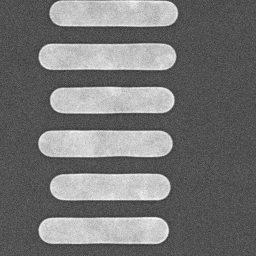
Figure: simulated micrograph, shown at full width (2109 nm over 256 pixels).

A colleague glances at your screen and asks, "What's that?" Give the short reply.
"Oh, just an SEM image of groups of lines, slits or small figures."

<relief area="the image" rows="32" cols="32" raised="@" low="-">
-------@@@@@@@@@@@@@@@----------
------@@@@@@@@@@@@@@@@----------
-------@@@@@@@@@@@@@@@----------
--------------------------------
--------------------------------
-----------------@@@------------
-----@@@@@@@@@@@@@@@@@----------
-----@@@@@@@@@@@@@@@@@----------
------@@@@@@@@@@@@@@@-----------
--------------------------------
--------------------------------
-------@@@@@@@@@@@@@@-----------
------@@@@@@@@@@@@@@@@----------
-------@@@@@@@@@@@@@@-----------
--------------------------------
--------------------------------
------@@@@@@@@@@@@@@------------
-----@@@@@@@@@@@@@@@@-----------
-----@@@@@@@@@@@@@@@@-----------
------@@@@@@@@--@@@@------------
--------------------------------
--------------------------------
-------@@@@@@@@@@@@@@-----------
------@@@@@@@@@@@@@@@-----------
-------@@@@@@@@@@@@@@-----------
--------------------------------
--------------------------------
------@@@@@@@@@@@@@@------------
-----@@@@@@@@@@@@@@@@-----------
-----@@@@@@@@@@@@@@@@-----------
--------------------------------
--------------------------------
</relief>